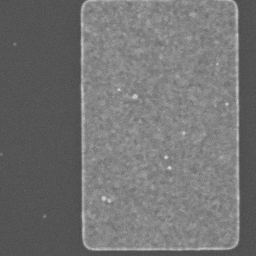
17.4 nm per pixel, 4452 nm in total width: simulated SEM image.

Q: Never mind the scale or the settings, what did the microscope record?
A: wiring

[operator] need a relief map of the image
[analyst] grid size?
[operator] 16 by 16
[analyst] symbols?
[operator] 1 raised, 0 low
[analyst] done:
0000011111111110
0000011111111110
0000011111111110
0000011111111110
0000011111111110
0000011111111110
0000011111111110
0000011111111110
0000011111111110
0000011111111110
0000011111111110
0000011111111110
0000011111111110
0000011111111110
0000011111111110
0000001111111100